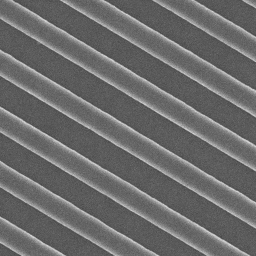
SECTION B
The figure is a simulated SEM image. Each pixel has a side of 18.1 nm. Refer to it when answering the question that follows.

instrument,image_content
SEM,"lines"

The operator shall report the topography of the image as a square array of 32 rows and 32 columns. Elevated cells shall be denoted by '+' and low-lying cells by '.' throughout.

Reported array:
++......++++++......+++++......+
++++......+++++.......+++++.....
++++++......+++++......+++++....
..+++++......++++++......+++++..
....+++++......+++++.......+++++
.....++++++......+++++......++++
.......+++++......++++++......++
++.......+++++......+++++.......
++++......++++++......+++++.....
+++++.......+++++......++++++...
..+++++.......+++++......+++++..
...++++++......++++++......+++++
.....+++++.......+++++......++++
.......+++++.......+++++......++
++......++++++......++++++......
++++......++++++......+++++.....
+++++.......+++++.......+++++...
..+++++......++++++......++++++.
...++++++......+++++.......+++++
.....+++++.......+++++.......+++
+......+++++.......+++++......++
++......++++++......++++++......
++++......+++++.......+++++.....
++++++......+++++.......+++++...
..+++++......++++++......++++++.
....+++++......+++++.......+++++
.....++++++......+++++.......+++
+......+++++......++++++......++
++.......+++++......+++++.......
++++......++++++......+++++.....
++++++......+++++......++++++...
..+++++.......+++++......+++++..